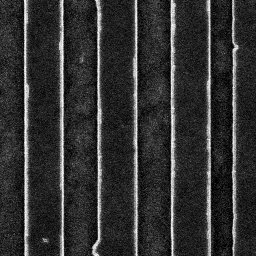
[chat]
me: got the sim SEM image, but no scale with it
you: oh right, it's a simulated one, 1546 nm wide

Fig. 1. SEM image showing one or a few lines or trenches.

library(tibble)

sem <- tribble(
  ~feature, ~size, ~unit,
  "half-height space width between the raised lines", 216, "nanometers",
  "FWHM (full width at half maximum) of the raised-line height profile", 227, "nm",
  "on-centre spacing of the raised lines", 444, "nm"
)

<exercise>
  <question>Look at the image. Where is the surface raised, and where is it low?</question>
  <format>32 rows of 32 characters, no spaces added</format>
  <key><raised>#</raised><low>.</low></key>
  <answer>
...#####....#####.....####...###
...#####....#####.....####...###
...#####....#####.....####...###
...#####....#####.....####...###
...#####....#####.....####...###
...#####....#####.....####...###
...#####....#####.....####...###
...#####....#####.....####...###
...#####....#####.....####...###
...#####....#####.....####...###
...#####....#####.....####...###
...#####....#####.....####...###
...#####....#####.....####...###
...#####....#####.....####...###
...#####....#####.....####...###
...#####....#####.....####...###
...#####....#####.....####...###
...#####....#####.....####...###
...#####....#####.....####...###
...#####....#####.....####...###
...#####....#####.....####...###
...#####....#####.....####...###
...#####....#####.....####...###
...#####....#####.....####...###
...#####....#####.....####...###
...#####....#####.....####...###
...#####....#####.....####...###
...#####....#####....#####...###
...#####....#####....#####...###
...#####....#####.....####...###
...#####....#####.....####...###
...#####....#####.....####...###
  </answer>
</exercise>